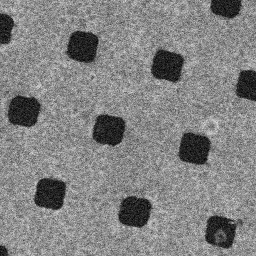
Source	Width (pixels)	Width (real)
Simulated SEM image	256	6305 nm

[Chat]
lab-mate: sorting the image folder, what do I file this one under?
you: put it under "a regular array of holes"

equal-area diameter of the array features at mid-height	816	nm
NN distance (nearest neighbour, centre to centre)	2130	nm